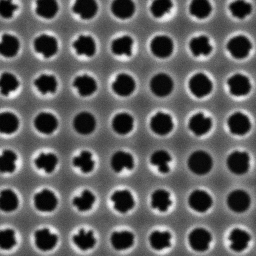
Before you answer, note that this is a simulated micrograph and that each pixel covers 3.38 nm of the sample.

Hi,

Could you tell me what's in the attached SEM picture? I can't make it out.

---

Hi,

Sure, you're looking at a regular array of holes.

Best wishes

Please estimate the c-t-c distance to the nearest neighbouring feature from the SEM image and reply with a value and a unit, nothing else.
129 nm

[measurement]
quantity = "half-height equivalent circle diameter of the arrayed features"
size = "74.4 nanometers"